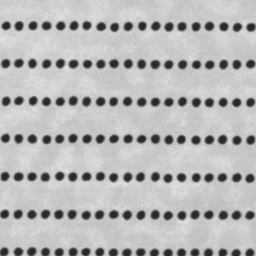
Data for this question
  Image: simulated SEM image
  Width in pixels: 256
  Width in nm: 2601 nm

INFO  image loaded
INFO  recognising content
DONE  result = a regular array of holes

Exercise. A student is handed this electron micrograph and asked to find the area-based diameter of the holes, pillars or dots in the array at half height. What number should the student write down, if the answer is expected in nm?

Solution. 93.1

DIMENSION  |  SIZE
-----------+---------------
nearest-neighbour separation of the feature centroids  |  135 nm